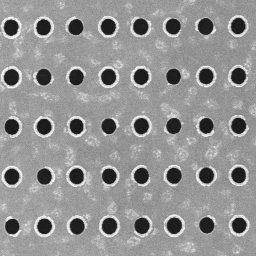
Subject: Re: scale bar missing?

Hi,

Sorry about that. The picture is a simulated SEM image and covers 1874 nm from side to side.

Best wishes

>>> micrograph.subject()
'a regular array of holes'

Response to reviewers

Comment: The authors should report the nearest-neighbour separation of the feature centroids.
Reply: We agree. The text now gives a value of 236 nanometers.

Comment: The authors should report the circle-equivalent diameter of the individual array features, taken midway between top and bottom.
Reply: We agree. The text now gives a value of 113 nm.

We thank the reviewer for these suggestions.